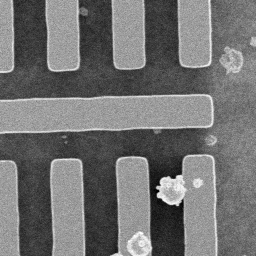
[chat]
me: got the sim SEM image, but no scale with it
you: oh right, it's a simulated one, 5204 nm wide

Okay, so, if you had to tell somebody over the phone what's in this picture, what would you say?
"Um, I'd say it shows groups of lines, slits or small figures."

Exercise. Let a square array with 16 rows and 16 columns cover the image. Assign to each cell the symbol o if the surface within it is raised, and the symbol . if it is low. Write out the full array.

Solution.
o..oo..oo..oo...
o..oo..oo..oo...
o..oo..oo..oo...
o..oo..oo..oo...
................
................
ooooooooooooo...
ooooooooooooo...
................
................
o..oo..oo..oo...
o..oo..oo.ooo...
o..oo..oo.ooo...
o..oo..oo...o...
o..oo..oo...oo..
o..oo..oo...oo..